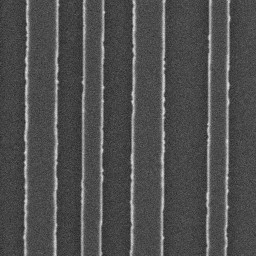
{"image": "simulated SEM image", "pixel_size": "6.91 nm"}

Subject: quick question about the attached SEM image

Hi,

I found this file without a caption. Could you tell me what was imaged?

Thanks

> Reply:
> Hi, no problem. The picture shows lines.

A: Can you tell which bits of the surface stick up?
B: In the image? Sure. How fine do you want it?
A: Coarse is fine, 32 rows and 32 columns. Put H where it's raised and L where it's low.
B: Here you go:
LLLHHHHLLLHHHLLLLHHHHLLLLLHHHLLL
LLLHHHHLLLHHHLLLLHHHHLLLLLHHHLLL
LLLHHHHLLLHHHLLLLHHHHLLLLLHHHLLL
LLLHHHHLLLHHHLLLLHHHHLLLLLHHHLLL
LLLHHHHLLLHHHLLLLHHHHLLLLLHHHLLL
LLLHHHHLLLHHHLLLLHHHHLLLLLHHHLLL
LLLHHHHLLLHHHLLLLHHHHLLLLLHHHLLL
LLLHHHHLLLHHHLLLLHHHHLLLLLHHHLLL
LLLHHHHLLLHHHLLLLHHHHLLLLLHHHLLL
LLLHHHHLLLHHHLLLLHHHHLLLLLHHLLLL
LLLHHHHLLLHHHLLLLHHHHLLLLLHHHLLL
LLLHHHHLLLHHHLLLLHHHHLLLLLHHLLLL
LLLHHHHLLLHHHLLLLHHHHLLLLLHHHLLL
LLLHHHHLLLHHHLLLLHHHHLLLLLHHHLLL
LLLHHHHLLLHHHLLLLHHHHLLLLLHHLLLL
LLLHHHHLLLHHHLLLLHHHLLLLLLHHLLLL
LLLHHHHLLLHHHLLLLHHHHLLLLLHHLLLL
LLLHHHHLLLHHHLLLLHHHHLLLLLHHLLLL
LLLHHHHLLLHHHLLLLHHHLLLLLLHHLLLL
LLLHHHHLLLHHHLLLHHHHLLLLLLHHLLLL
LLLHHHHLLLHHHLLLHHHHLLLLLLHHLLLL
LLLHHHHLLLHHHLLLHHHHLLLLLLHHLLLL
LLLHHHHLLLHHHLLLHHHHLLLLLLHHLLLL
LLLHHHHLLLHHHLLLHHHHLLLLLLHHLLLL
LLLHHHHLLLHHHLLLHHHHLLLLLLHHLLLL
LLLHHHHLLLHHHLLLHHHHLLLLLLHHLLLL
LLLHHHHLLLHHHLLLHHHHLLLLLLHHLLLL
LLLHHHHLLLHHHLLLHHHHLLLLLLHHLLLL
LLLHHHHLLLHHHLLLHHHHLLLLLLHHLLLL
LLLHHHHLLLHHHLLLHHHHLLLLLLHHLLLL
LLLHHHHLLLHHHLLLHHHHLLLLLLHHLLLL
LLLHHHHLLLHHHLLLHHHHLLLLLLHHLLLL